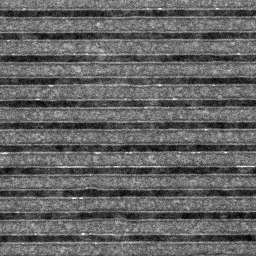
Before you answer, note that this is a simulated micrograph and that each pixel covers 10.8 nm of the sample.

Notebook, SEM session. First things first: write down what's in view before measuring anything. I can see parallel lines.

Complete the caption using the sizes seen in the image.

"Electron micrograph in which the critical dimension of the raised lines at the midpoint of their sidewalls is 86.7 nm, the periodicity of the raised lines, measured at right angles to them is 244 nanometers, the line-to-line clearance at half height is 0.154 micrometres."